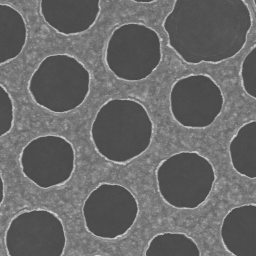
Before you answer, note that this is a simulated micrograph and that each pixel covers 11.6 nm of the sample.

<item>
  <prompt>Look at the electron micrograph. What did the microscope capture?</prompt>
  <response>holes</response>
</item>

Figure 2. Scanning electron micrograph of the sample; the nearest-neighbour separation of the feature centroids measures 918 nm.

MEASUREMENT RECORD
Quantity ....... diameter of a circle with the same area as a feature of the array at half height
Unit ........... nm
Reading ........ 645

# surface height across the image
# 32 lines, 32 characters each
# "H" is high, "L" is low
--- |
HHHHHLLLLLLLHHHHHHHHHHLLLLLLLLLH
LLHHHLLLLLLLHHHHHHHHHLLLLLLLLLLH
LLLHHHLLLLLLHHHHHHHHHLLLLLLLLLLH
LLLHHHHLLLLHHHHLLLHHHLLLLLLLLLLH
LLLHHHHHHHHHHHLLLLLLHLLLLLLLLLLH
LLLHHHHHHHHHHHLLLLLLHLLLLLLLLLHH
LLLHHHHHHHHHHLLLLLLLHHLLLLLLLLHL
LHHHHHLLLHHHHLLLLLLLHHHLLLLLHHHL
HHHHHLLLLLLHHHLLLLLHHHHHHHHHHHLL
HHHHLLLLLLLHHHHLLLHHHHHHLHHHHHLL
HHHHLLLLLLLHHHHHHHHHHHLLLLLHHHLL
LHHHLLLLLLLHHHHHHHHHHLLLLLLLHHHL
LHHHLLLLLLHHHHLLHHHHHLLLLLLLHHHH
LLHHHHLLLHHHHLLLLLHHHLLLLLLLHHHH
LLHHHHHHHHHHLLLLLLLHHHLLLLLHHHHH
LHHHHHHHHHHHLLLLLLLHHHHLLLHHHHHL
LHHHHHHHHHHLLLLLLLLHHHHHHHHHHHLL
HHHHLLLLHHHHLLLLLLLHHHHHHHHHHLLL
HHHLLLLLLHHHLLLLLLHHHHHHHHHHHLLL
HHHLLLLLLHHHHLLLLHHHHHLLLHHHHLLL
HHHLLLLLLHHHHHHHHHHHLLLLLLHHHLLL
HHHLLLLLLHHHHHHHHHHHLLLLLLLHHHLL
HHHHLLLLHHHHHHHHHHHHLLLLLLLHHHHH
HHHHHHHHHHHHLLLLHHHHLLLLLLHHHHHH
HHHHHHHHHHHLLLLLLHHHLLLLLLHHHHHH
HHHHHHHHHHHLLLLLLHHHHLLLLHHHHHHH
HHHHLLHHHHLLLLLLLHHHHHHHHHHHHLLL
HHLLLLLHHHHLLLLLLHHHHHHHHHHHLLLL
HLLLLLLLHHHLLLLLHHHHHHHHHHHHLLLL
HLLLLLLLHHHHLLLHHHHHLLLHHHHHLLLL
HLLLLLLLHHHHHHHHHHHLLLLLHHHHLLLL
HLLLLLLLHHHHHHHHHHLLLLLLLHHHHLLL